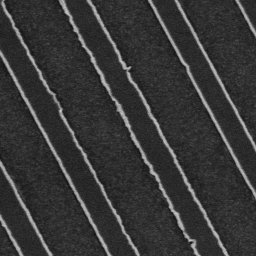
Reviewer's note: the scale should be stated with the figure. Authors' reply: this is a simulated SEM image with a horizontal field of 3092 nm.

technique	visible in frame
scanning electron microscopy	one or a few lines or trenches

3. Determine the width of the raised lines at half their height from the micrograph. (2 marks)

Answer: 307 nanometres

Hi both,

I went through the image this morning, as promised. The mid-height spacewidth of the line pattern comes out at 627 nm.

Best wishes